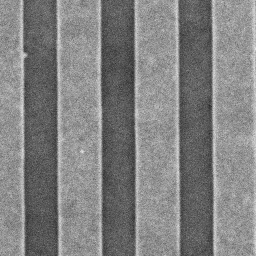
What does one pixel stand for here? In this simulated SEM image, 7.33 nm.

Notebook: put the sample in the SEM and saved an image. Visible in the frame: wiring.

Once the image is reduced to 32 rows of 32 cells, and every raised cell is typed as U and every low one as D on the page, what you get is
UUUDDDDUUUUUDDDDDUUUUUDDDDDUUUUU
UUUDDDDUUUUUDDDDDUUUUUDDDDDUUUUU
UUUDDDDUUUUUDDDDDUUUUUDDDDDUUUUU
UUUDDDDUUUUUDDDDDUUUUUDDDDDUUUUU
UUUDDDDUUUUUDDDDDUUUUUDDDDDUUUUU
UUUDDDDUUUUUDDDDDUUUUUDDDDDUUUUU
UUUDDDDUUUUUDDDDDUUUUUDDDDDUUUUU
UUUDDDDUUUUUDDDDDUUUUUDDDDDUUUUU
UUUDDDDUUUUUDDDDDUUUUUDDDDDUUUUU
UUUDDDDUUUUUDDDDDUUUUUDDDDDUUUUU
UUUDDDDUUUUUDDDDDUUUUUDDDDDUUUUU
UUUDDDDUUUUUDDDDDUUUUUDDDDDUUUUU
UUUDDDDUUUUUDDDDDUUUUUDDDDDUUUUU
UUUDDDDUUUUUUDDDDUUUUUDDDDDUUUUU
UUUDDDDUUUUUUDDDDUUUUUDDDDDUUUUU
UUUDDDDUUUUUUDDDDUUUUUDDDDDUUUUU
UUUDDDDUUUUUUDDDDUUUUUDDDDDUUUUU
UUUDDDDUUUUUUDDDDUUUUUDDDDDUUUUU
UUUDDDDUUUUUUDDDDUUUUUDDDDDUUUUU
UUUDDDDUUUUUUDDDDUUUUUDDDDDUUUUU
UUUDDDDUUUUUUDDDDUUUUUDDDDDUUUUU
UUUDDDDUUUUUUDDDDUUUUUDDDDDUUUUU
UUUDDDDUUUUUUDDDDUUUUUDDDDDUUUUU
UUUDDDDUUUUUUDDDDUUUUUDDDDDUUUUU
UUUDDDDUUUUUUDDDDUUUUUDDDDDUUUUU
UUUDDDDUUUUUUDDDDUUUUUDDDDDUUUUU
UUUDDDDUUUUUUDDDDUUUUUDDDDDUUUUU
UUUDDDDUUUUUUDDDDUUUUUDDDDDUUUUU
UUUDDDDUUUUUUDDDDUUUUUDDDDDUUUUU
UUUDDDDUUUUUUDDDDUUUUUDDDDDUUUUU
UUUDDDDUUUUUUDDDDUUUUUDDDDDUUUUU
UUUDDDDUUUUUUDDDDUUUUUDDDDDUUUUU